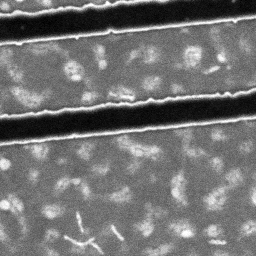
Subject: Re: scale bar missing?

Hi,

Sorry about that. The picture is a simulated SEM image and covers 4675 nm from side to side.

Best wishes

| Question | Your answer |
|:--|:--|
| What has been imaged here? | one or a few lines or trenches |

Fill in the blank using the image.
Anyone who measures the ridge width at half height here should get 531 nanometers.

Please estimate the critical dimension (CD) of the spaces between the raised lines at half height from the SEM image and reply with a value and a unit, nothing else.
1310 nm